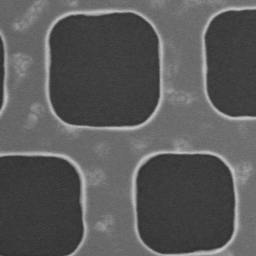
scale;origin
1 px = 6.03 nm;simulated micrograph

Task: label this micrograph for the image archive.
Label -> holes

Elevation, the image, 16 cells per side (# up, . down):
################
###......####...
###.......###...
###.......###...
###.......###...
###.......###...
###.......###...
####.....#######
################
################
.....####.....##
.....###.......#
.....###.......#
.....####......#
.....####......#
.....####.....##